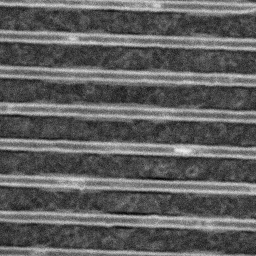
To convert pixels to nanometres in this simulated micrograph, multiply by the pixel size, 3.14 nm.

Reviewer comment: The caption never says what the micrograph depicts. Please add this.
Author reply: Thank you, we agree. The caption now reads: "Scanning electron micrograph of parallel lines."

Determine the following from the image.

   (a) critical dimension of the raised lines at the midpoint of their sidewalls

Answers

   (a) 32.5 nm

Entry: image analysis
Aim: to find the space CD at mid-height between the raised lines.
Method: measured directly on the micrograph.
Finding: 26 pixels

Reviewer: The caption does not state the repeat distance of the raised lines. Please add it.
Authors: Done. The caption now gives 113 nm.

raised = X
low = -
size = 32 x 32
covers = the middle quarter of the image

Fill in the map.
--------------------------------
XXXXX---------------------------
XXXXXXXXXXXXXXXXXXXXXXXXXXXXXXXX
XXXXXXXXXXXXXXXXXXXXXXXXXXXXXXXX
----------------------XXXXXXXXXX
--------------------------------
--------------------------------
--------------------------------
--------------------------------
--------------------------------
XXXXXX--------------------------
XXXXXXXXXXXXXXXXXXXXXXXXXXXXXXXX
XXXXXXXXXXXXXXXXXXXXXXXXXXXXXXXX
-------------------XXXXXXXXXXXXX
--------------------------------
--------------------------------
--------------------------------
--------------------------------
--------------------------------
XXXX----------------------------
XXXXXXXXXXXXXXXXXXXXXXXXXXXXXXXX
XXXXXXXXXXXXXXXXXXXXXXXXXXXXXXXX
--------------------XXXXXXXXXXXX
--------------------------------
--------------------------------
--------------------------------
--------------------------------
--------------------------------
XXXXXX--------------------------
XXXXXXXXXXXXXXXXXXXXXXXXXXXXX--X
XXXXXXXXXXXXXXXXXXXXXXXXXXXXXXXX
------------------XXXXXXXXXXXXXX